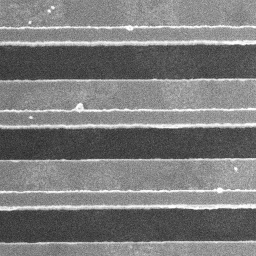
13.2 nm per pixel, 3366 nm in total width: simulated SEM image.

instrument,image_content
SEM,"lines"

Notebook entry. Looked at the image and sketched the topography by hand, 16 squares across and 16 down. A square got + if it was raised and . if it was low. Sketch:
++++++++++++++++
++++++++++++++++
++++++++++++++++
................
................
++++++++++++++++
++++++++++++++++
++++++++++++++++
................
................
++++++++++++++++
++++++++++++++++
++++++++++++++++
................
................
++++++++++++++++